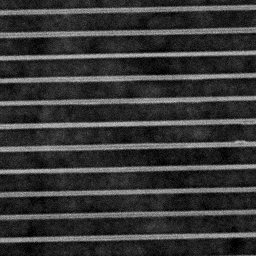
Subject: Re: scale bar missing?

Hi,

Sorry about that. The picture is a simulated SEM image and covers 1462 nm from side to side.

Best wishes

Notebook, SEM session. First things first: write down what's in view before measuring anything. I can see parallel lines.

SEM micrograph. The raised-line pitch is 130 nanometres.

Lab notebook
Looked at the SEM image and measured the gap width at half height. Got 113 nanometers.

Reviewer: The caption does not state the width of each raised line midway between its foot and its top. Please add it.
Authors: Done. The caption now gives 17.1 nanometers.